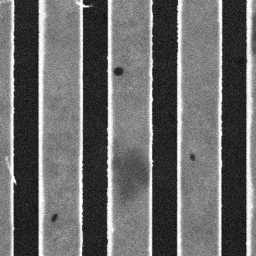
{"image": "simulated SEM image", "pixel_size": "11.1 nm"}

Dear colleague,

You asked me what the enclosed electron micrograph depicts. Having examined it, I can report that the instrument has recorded lines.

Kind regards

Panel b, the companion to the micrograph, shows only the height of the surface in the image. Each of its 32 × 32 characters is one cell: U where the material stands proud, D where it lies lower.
UUDDDUUUUUDDDDUUUUUDDDUUUUUUDDDU
UUDDDUUUUUDDDDUUUUUDDDUUUUUUDDDU
UUDDDUUUUUDDDDUUUUUDDDUUUUUUDDDU
UUDDDUUUUUDDDDUUUUUDDDUUUUUUDDDU
UUDDDUUUUUDDDDUUUUUDDDUUUUUUDDDU
UUDDDUUUUUDDDDUUUUUDDDUUUUUUDDDU
UUDDDUUUUUDDDDUUUUUDDDUUUUUUDDDU
UUDDDUUUUUDDDDUUUUUDDDUUUUUUDDDU
UUDDDUUUUUDDDDUUUUUDDDUUUUUUDDDU
UUDDDUUUUUDDDDUUUUUDDDUUUUUUDDDU
UUDDDUUUUUDDDDUUUUUDDDUUUUUUDDDU
UUDDDUUUUUDDDDUUUUUDDDUUUUUUDDDU
UUDDDUUUUUDDDDUUUUUDDDUUUUUUDDDU
UUDDDUUUUUDDDDUUUUUDDDUUUUUUDDDU
UUDDDUUUUUDDDDUUUUUDDDUUUUUUDDDU
UUDDDUUUUUDDDDUUUUUDDDUUUUUUDDDU
UUDDDUUUUUDDDDUUUUUDDDUUUUUUDDDU
UUDDDUUUUUDDDDUUUUUDDDUUUUUUDDDU
UUDDDUUUUUDDDDUUUUUDDDUUUUUUDDDU
UUDDDUUUUUDDDDUUUUUDDDUUUUUUDDDU
UUDDDUUUUUDDDDUUUUUDDDUUUUUUDDDU
UUDDDUUUUUDDDDUUUUUDDDUUUUUUDDDU
UUDDDUUUUUDDDDUUUUUDDDUUUUUUDDDU
UUDDDUUUUUDDDDUUUUUDDDUUUUUUDDDU
UUDDDUUUUUDDDDUUUUUDDDUUUUUUDDDU
UUDDDUUUUUDDDDUUUUUDDDUUUUUUDDDU
UUDDDUUUUUDDDDUUUUUDDDUUUUUUDDDU
UUDDDUUUUUDDDDUUUUUDDDUUUUUUDDDU
UUDDDUUUUUDDDDUUUUUDDDUUUUUUDDDU
UUDDDUUUUUDDDDUUUUUDDDUUUUUUDDDU
UUDDDUUUUUDDDDUUUUUDDDUUUUUUDDDU
UUDDDUUUUUDDDDUUUUUDDDUUUUUUDDDU